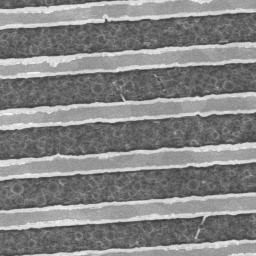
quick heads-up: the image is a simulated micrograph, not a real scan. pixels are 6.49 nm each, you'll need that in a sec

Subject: parallel lines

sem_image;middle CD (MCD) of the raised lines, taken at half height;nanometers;113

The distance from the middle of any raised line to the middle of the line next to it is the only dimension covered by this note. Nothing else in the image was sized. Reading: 0.325 microns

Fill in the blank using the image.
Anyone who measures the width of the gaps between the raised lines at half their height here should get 207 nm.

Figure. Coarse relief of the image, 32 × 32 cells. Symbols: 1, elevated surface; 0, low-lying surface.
00000000000111111111111111111111
11111111111111111111111111110000
11111111111110000000000000000000
00000000000000000000000000000000
00000000000000000000000000000000
00000000000000000000000000000111
00000000000000000111111111111111
01111111111111111111111111111111
11111111111111111100000000000000
11111000000000000000000000000000
00000000000000000000000000000000
00000000000000000000000000000000
00000000000000000000111111111111
00000101111111111111111111111111
11111111111111111111110000000000
11111111100000000000000000000000
00000000000000000000000000000000
00000000000000000000000000000000
00000000000000000000000001111111
00000001000111111111111111111111
11111111111111111111111111000000
11111111111100000000000000000000
00000000000000000000000000000000
00000000000000000000000000000000
00000000000000000000000000001111
00000000000001111111111111111111
11111111111111111111111111111110
11111111111111111000000000000000
11000000000000000000000000000000
00000000000000000000000000000000
00000000000000000000000000111111
00000000000101111111111111111111